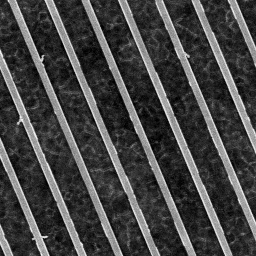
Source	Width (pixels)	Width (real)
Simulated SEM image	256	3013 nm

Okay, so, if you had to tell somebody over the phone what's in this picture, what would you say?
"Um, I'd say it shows parallel lines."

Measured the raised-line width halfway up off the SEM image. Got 80.1 nm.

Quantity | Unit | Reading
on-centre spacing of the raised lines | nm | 398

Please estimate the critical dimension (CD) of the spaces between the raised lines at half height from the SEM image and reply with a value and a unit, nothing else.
323 nanometres